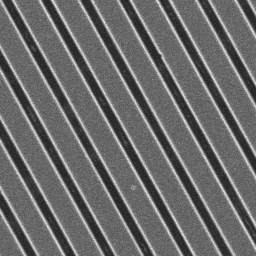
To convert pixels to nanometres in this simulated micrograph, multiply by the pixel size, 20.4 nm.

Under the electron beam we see parallel lines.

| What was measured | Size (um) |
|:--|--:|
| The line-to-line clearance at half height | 0.19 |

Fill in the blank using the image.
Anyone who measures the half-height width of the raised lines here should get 516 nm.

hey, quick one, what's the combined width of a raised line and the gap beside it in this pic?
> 700 nanometres